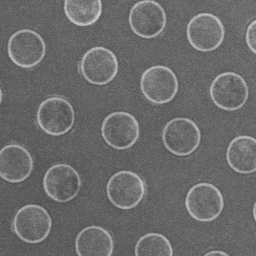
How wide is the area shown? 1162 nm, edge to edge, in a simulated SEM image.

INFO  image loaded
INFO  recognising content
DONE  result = a regular array of raised bodies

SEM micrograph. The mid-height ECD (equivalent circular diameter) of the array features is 0.163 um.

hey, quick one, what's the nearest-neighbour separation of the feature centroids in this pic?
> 270 nanometres